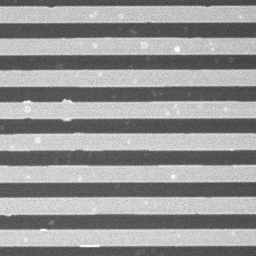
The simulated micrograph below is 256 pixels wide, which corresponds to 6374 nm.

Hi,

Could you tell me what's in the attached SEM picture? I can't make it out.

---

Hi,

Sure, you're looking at parallel lines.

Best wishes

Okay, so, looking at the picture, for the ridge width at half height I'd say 0.389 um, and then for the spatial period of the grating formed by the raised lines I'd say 0.794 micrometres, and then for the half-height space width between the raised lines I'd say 402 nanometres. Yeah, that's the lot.